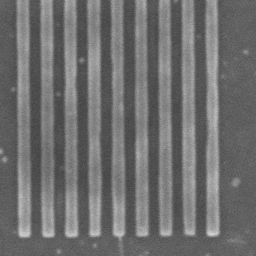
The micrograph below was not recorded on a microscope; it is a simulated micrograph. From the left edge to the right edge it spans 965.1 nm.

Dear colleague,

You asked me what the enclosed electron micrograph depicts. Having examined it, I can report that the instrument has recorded groups of lines, slits or small figures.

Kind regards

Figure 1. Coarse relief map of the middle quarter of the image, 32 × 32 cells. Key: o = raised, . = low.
ooo...ooo...oo....ooo...oo....oo
ooo...ooo...oo....ooo...oo....oo
ooo...ooo...oo....ooo...oo....oo
.oo...ooo...ooo...ooo...oo....oo
.oo...ooo...ooo...ooo...oo....oo
.oo...ooo...ooo...ooo...oo....oo
ooo...ooo...ooo...ooo...oo....oo
ooo...ooo...ooo...ooo...oo....oo
ooo...ooo...ooo...ooo...oo....oo
ooo...ooo...oo....ooo...oo....oo
ooo...ooo...ooo...ooo...oo....oo
ooo...ooo...ooo...ooo...oo....oo
ooo...ooo...ooo...ooo...oo....oo
ooo...ooo...ooo...ooo...oo....oo
ooo...ooo...ooo...ooo...oo....oo
ooo...ooo...ooo...ooo...oo....oo
ooo...ooo...ooo...ooo...ooo...oo
ooo...ooo...ooo...ooo...ooo...oo
ooo...ooo...ooo...ooo...ooo...oo
.oo....oo...ooo...ooo...ooo...oo
.oo....oo...ooo...ooo...ooo...oo
ooo....oo...ooo...ooo...ooo...oo
ooo....oo...ooo...ooo...ooo...oo
ooo....oo...ooo...ooo...ooo...oo
ooo...ooo...ooo...ooo...ooo...oo
ooo...ooo...ooo...ooo...ooo...oo
ooo...ooo...ooo...ooo...ooo...oo
ooo...ooo...ooo...ooo...ooo...oo
ooo...ooo...ooo...ooo...ooo...oo
ooo...ooo...ooo...ooo...ooo...oo
ooo...ooo...ooo...ooo...ooo...oo
ooo...ooo...ooo...ooo...ooo...oo